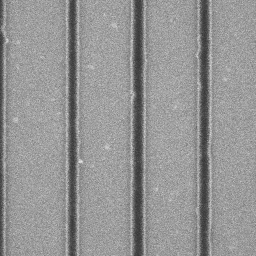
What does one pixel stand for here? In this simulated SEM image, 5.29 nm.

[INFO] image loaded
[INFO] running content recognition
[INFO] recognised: one or a few lines or trenches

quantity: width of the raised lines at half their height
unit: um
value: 0.0714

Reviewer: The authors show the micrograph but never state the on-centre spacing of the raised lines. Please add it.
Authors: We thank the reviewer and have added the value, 0.349 micrometres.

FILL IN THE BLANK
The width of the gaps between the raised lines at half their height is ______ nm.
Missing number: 276